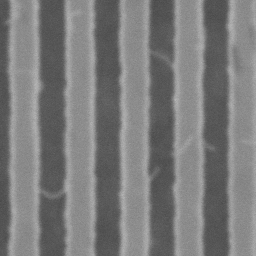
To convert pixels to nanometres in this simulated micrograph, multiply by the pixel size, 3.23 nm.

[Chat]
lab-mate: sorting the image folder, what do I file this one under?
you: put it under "lines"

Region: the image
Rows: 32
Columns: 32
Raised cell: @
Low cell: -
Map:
-@@@@---@@@@---@@@@---@@@----@@@
-@@@@---@@@@---@@@@---@@@----@@@
-@@@@---@@@@---@@@@---@@@----@@@
-@@@@---@@@@---@@@@---@@@---@@@@
-@@@@---@@@@---@@@@---@@@@---@@@
-@@@@---@@@@---@@@----@@@@---@@@
-@@@@---@@@@---@@@@---@@@----@@@
-@@@@---@@@@---@@@@---@@@----@@@
-@@@@---@@@@---@@@@---@@@----@@@
-@@@@---@@@@---@@@@---@@@----@@@
-@@@@---@@@@---@@@@---@@@----@@@
-@@@@---@@@@---@@@@---@@@----@@@
-@@@@---@@@@---@@@@---@@@----@@@
-@@@@---@@@@---@@@@---@@@----@@@
-@@@@---@@@@---@@@@---@@@----@@@
-@@@@---@@@@---@@@@---@@@----@@@
-@@@@---@@@@---@@@----@@@---@@@@
-@@@@---@@@@---@@@----@@@----@@@
-@@@@---@@@@---@@@@---@@@----@@@
-@@@@---@@@@---@@@@---@@@----@@@
-@@@@---@@@@---@@@----@@@----@@@
-@@@@---@@@@---@@@----@@@----@@@
-@@@@---@@@@---@@@@---@@@----@@@
-@@@@---@@@@---@@@@---@@@---@@@@
-@@@@---@@@@---@@@@---@@@----@@@
-@@@@---@@@@---@@@@---@@@----@@@
-@@@@---@@@@---@@@@---@@@----@@@
-@@@@---@@@@---@@@@---@@@----@@@
-@@@@---@@@@---@@@@---@@@----@@@
-@@@@---@@@@---@@@@---@@@----@@@
-@@@@---@@@@---@@@----@@@----@@@
-@@@@---@@@@---@@@----@@@----@@@